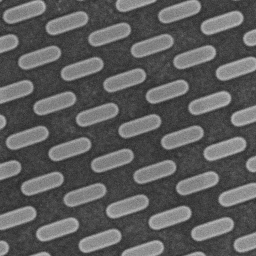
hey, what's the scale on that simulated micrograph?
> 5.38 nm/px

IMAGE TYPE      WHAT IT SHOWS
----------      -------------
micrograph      groups of lines, slits or small figures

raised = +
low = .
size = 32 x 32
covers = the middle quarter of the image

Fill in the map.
.+++++++++..................++++
+++++++++........+++............
++++++........++++++............
++++.......+++++++++............
..........++++++++++.......+++..
..........+++++++.......+++++++.
..........++++.......++++++++++.
++...................+++++++++..
+++..................++++++.....
+++..................+++........
+........++++..................+
......+++++++..................+
....+++++++++...................
...++++++++........+++++........
...++++++.......++++++++........
....++........++++++++++........
..............++++++++........++
..............+++++.......++++++
....++...................+++++++
.+++++..................++++++++
+++++++..................++++...
++++++........+++...............
++++.......++++++...............
+.......+++++++++...............
.......++++++++++........++.....
.......++++++........+++++++....
.......++++.......++++++++++....
..................+++++++++.....
..................++++++........
..................+++........+++
......++++..................++++
...+++++++..................++++